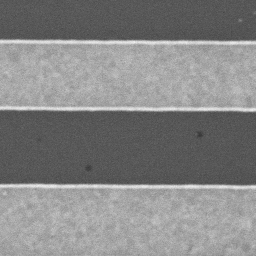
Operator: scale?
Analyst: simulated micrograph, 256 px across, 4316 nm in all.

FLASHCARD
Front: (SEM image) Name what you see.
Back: wiring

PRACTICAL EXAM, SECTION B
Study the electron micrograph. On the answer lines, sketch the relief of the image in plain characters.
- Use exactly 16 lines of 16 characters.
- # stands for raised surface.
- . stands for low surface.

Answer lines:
................
................
................
################
################
################
################
................
................
................
................
................
################
################
################
################